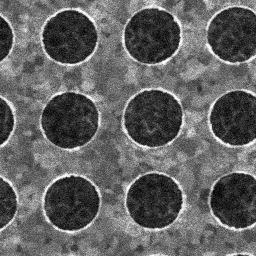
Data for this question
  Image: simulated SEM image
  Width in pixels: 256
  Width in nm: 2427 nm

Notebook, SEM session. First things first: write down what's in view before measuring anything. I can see holes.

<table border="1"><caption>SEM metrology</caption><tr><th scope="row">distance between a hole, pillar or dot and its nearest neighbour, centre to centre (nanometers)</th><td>782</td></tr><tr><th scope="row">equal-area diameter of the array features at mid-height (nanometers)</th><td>532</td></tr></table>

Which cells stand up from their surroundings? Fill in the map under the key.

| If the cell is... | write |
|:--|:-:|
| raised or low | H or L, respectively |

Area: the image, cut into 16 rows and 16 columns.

HHHHHHHHHHHHHHLH
LHHLLLHHLLLHHLLL
LHHLLLHHLLLHHLLL
HHHLLLHHLLLHHHLL
HHHHHHHHHHHHHHHH
HHHHHHHHHHHHHHHH
HHHLLLHHLLLHHLLL
LHHLLLHHLLLHHLLL
LHHLLLHHLLLHHHLL
HHHHHHHHHHHHHHHH
HHHHHHHHHHHHHHHH
HHHLLLHHLLLHHLLL
LHHLLLHHLLLHHLLL
LHHLLLHHLLLHHLLL
HHHHHHHHHHHHHHHH
HHHHHHHHHHHHHHHH